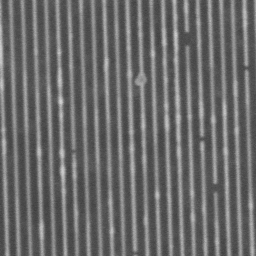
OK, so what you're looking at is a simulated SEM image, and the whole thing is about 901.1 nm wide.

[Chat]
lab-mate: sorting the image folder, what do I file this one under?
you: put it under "parallel lines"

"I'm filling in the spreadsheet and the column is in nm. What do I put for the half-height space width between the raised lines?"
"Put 32.5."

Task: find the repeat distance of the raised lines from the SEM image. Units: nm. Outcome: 41.1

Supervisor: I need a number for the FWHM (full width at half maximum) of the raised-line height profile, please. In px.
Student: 2.5